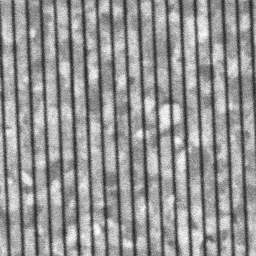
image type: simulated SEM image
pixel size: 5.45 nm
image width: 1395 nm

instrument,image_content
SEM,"parallel lines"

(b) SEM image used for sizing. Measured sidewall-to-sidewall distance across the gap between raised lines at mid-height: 21.1 nm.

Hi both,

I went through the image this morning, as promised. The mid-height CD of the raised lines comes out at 57.1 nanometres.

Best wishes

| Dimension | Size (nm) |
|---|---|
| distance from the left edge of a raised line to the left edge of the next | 76.1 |